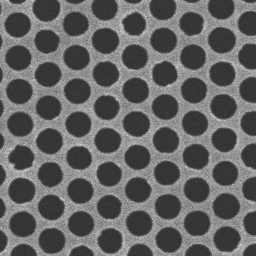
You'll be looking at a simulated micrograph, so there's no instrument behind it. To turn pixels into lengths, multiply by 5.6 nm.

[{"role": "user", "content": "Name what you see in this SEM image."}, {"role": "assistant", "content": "a regular array of holes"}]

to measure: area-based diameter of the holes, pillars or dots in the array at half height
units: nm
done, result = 146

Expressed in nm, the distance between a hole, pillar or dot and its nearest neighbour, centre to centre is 185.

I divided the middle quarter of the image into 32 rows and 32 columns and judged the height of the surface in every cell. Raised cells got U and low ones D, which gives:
UDDDDDUUDDDDDUUDDDDDUUDDDDDDUUDD
UUDDUUUDDDDDDUUUUUUUUUDDDDDDUUUU
UUUUUUUDDDDDDDUUUUUUUUDDDDDDUUUU
UUUUUUUDDDDDDDUUUDDUUUDDDDDDUUUD
UDDDDDUUDDDDDUUDDDDDUUDDDDDDUUDD
DDDDDDDUUDDUUUUDDDDDDUUUDDUUUDDD
DDDDDDDUUUUUUUDDDDDDDUUUUUUUUDDD
DDDDDDDUUUUUUUUDDDDDDUUUUUUUUDDD
DDDDDDUUDDDDDUUDDDDDDUUDDDDDUUDD
UUDDDUUUDDDDDUUUUDDDUUDDDDDDUUUD
UUUUUUUDDDDDDDUUUUUUUUDDDDDDDUUU
UUUUUUUUDDDDDDUUUUUUUUDDDDDDDUUU
UUDDDDUUDDDDDUUUDDDDUUDDDDDDUUDD
UDDDDDDUUDDDUUUDDDDDDUUUDDDUUUDD
DDDDDDDUUUUUUUUDDDDDDDUUUUUUUDDD
DDDDDDDUUUUUUUUDDDDDDDUUUUUUUDDD
UDDDDDDUUDDDDUUDDDDDDUUDDDDUUUDD
UUDDDDUUDDDDDDUUDDDDUUUDDDDDUUUD
UUUUUUUUDDDDDDUUUUUUUUDDDDDDDUUU
UUUUUUUUDDDDDDUUUUUUUUDDDDDDDUUU
UUUUUUUUDDDDDDUUUDDDUUDDDDDDDUUU
UDDDDDUUUDDDDUUUDDDDDUUDDDDDUUDD
UDDDDDDUUUUUUUUDDDDDDDUUUUUUUUDD
UDDDDDDUUUUUUUUDDDDDDDUUUUUUUUDD
UDDDDDDUUUUDUUUDDDDDDDUUDDDUUUDD
UDDDDDUUUDDDDUUUDDDDDUUDDDDDUUUD
UUUUDUUUDDDDDDUUUUDUUUDDDDDDDUUU
UUUUUUUUDDDDDDUUUUUUUUDDDDDDDUUU
UUUUUUUUDDDDDDUUUDDDUUUDDDDDDUUU
UUDDDDUUUDDDDDUUDDDDDUUDDDDDUUUD
UDDDDDDUUUDDUUUDDDDDDDUUUUUUUUDD
UDDDDDDUUUUUUUUDDDDDDDUUUUUUUUDD